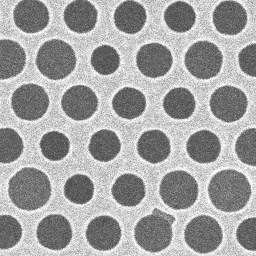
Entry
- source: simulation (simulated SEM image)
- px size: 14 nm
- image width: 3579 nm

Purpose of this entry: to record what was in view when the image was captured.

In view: a regular array of holes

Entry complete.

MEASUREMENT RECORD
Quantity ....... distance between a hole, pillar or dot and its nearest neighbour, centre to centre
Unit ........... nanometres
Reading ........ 688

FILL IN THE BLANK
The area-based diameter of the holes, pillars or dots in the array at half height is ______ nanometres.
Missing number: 513